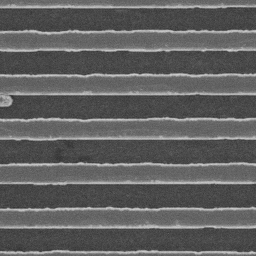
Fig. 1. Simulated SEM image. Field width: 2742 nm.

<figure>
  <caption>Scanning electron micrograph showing lines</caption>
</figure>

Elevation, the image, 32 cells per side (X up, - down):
XXXXXXXXXXXXXXXXXXXXXXXXXXXXXXXX
--------------------------------
--------------------------------
--------------------------------
XXXXXXXXXXXXXXXXXXXXXXXXXXXXXXXX
XXXXXXXXXXXXXXXXXXXXXXXXXXXXXXXX
--------------------------------
--------------------------------
--------------------------------
X----XXXXX-XXXXXXXXXXXXX-XXXXXXX
XXXXXXXXXXXXXXXXXXXXXXXXXXXXXXXX
XXXXXXXXXXXXXXXXXXXXXXXXXXXXXXXX
X-------------------------------
--------------------------------
--------------------------------
XXXXXXXXXXXXXXXXXXXXXXXXXXXXXXXX
XXXXXXXXXXXXXXXXXXXXXXXXXXXXXXXX
--------------------------------
--------------------------------
--------------------------------
-----XXXXXXX-XX-XXXX------XXXXXX
XXXXXXXXXXXXXXXXXXXXXXXXXXXXXXXX
XXXXXXXXXXXXXXXXXXXXXXXXXXXXXXXX
--------------------------------
--------------------------------
--------------------------------
XXXXXXXXXXXXXXXXXXXXXXXXXXXXXXXX
XXXXXXXXXXXXXXXXXXXXXXXXXXXXXXXX
--------------------------------
--------------------------------
--------------------------------
X----XXXXXXXXXX-XXXXXXXX-XXXX---